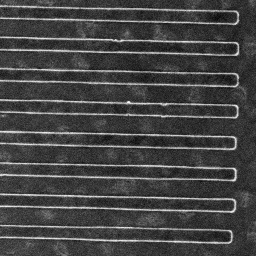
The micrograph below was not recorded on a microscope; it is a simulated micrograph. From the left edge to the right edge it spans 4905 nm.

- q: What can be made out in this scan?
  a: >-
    parallel lines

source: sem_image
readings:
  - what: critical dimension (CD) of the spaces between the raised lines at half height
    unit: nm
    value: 364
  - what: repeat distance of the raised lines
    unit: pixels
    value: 31.3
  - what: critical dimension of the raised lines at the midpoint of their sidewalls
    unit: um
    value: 0.237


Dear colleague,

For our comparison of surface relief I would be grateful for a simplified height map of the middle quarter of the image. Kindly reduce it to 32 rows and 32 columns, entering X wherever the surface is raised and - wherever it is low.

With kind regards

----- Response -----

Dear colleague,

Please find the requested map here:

--------------------------------
--------------------------------
XXXXXXXXXXXXXXXXXXXXXXXXXXXXXXXX
XXXXXXXXXXXXXXXXXXXXXXXXXXXXXXXX
XXXXXXXXXXXXXXXXXXXXXXXXXXXXXXXX
--------------------------------
--------------------------------
--------------------------------
--------------------------------
XX------------------------------
XXXXXXXXXXXXXXXXXXXXXXXXXXXXXXXX
XXXXXXXXXXXXXXXXXXXXXXXXXXXXXXXX
-----XXXXXXXXXXXXXXXXXXXXXXXXXXX
--------------------------------
--------------------------------
--------------------------------
--------------------------------
XXXXXXXXXXX---------------------
XXXXXXXXXXXXXXXXXXXXXXXXXXXXXXXX
XXXXXXXXXXXXXXXXXXXXXXXXXXXXXXXX
--XXXXXXXXX-XXXXXXXXXXXXXXXXXXXX
--------------------------------
--------------------------------
--------------------------------
--------------------------------
XXXXXXXXXXXXXXXXXXXXXX----------
XXXXXXXXXXXXXXXXXXXXXXXXXXXXXXXX
XXXXXXXXXXXXXXXXXXXXXXXXXXXXXXXX
------------------XXXXXXXXXXXXXX
--------------------------------
--------------------------------
--------------------------------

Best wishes